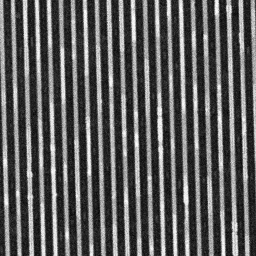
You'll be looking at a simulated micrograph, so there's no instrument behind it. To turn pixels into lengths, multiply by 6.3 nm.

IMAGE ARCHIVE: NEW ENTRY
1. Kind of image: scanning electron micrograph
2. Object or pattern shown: parallel lines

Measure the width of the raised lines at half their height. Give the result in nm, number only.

26.8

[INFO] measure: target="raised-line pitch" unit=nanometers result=75.5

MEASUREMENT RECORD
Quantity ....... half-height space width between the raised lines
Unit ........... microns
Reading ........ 0.0488